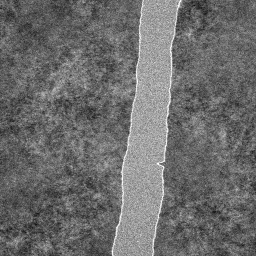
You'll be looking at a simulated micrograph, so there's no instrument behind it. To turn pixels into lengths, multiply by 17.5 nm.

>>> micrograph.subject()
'one or a few lines or trenches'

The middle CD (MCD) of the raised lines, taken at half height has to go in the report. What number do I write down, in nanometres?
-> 633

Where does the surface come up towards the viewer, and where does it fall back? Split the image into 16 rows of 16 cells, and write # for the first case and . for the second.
.........##.....
.........##.....
.........##.....
.........##.....
.........##.....
.........##.....
........###.....
........##......
........##......
........##......
........##......
........##......
........##......
........##......
.......###......
.......###......